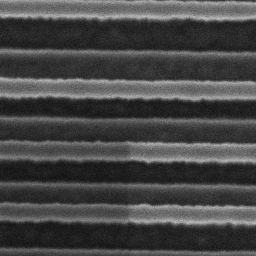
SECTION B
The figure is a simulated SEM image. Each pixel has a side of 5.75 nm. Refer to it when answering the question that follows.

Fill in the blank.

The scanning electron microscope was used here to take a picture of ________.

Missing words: lines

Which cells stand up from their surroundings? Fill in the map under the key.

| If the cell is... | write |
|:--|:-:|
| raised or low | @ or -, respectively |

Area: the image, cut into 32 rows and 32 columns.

@@@@@@@@@@@@@@@@@@@@@@@@@@@@@@@@
@@@@@@@@@@@@@@@@@@@@@@@@@@@@@@@@
--------------------------------
--------------------------------
--------------------------------
--------------------------------
@@@@@@@@@@@@----@---------------
@@@@@@@@@@@@@@@@@@@@@@@@@@@@@@@@
@@@@@@@@@@@@@@@@@@@@@@@@@@@@@@@@
@@@@@@@@@@@@@@@@@@@@@@@@@@@@@@@@
@@@@@@@@@@@@@@@@@@@@@@@@@@@@@@@@
@@@@@@@@@@@@@@@@@@@@@@@@@@@@@@@@
------------------------@-------
--------------------------------
--------------------------------
@@@@@@@@@@@@@@@@@@@@@@@@@@@@@@@@
@@@@@@@@@@@@@@@@@@@@@@@@@@@@@@@@
@@@@@@@@@@@@@@@@@@@@@@@@@@@@@@@@
@@@@@@@@@@@@@@@@@@@@@@@@@@@@@@@@
@@@@@@@@@@@@@@@@@@@@@@@@@@@@@@@@
--------------------------------
--------------------------------
--------------------------------
@@@@@@@@@@@@@@@@@@@@@@@@@@@@@@@@
@@@@@@@@@@@@@@@@@@@@@@@@@@@@@@@@
@@@@@@@@@@@@@@@@@@@@@@@@@@@@@@@@
@@@@@@@@@@@@@@@@@@@@@@@@@@@@@@@@
--@-@@-@@@@@@@@@@@@@@@@@@@@@@@@@
--------------------------------
--------------------------------
--------------------------------
@@@@@@@@@@@@@@@@@@@-------------